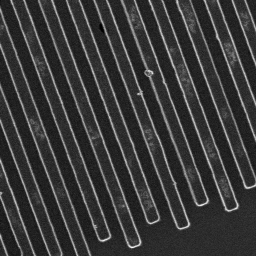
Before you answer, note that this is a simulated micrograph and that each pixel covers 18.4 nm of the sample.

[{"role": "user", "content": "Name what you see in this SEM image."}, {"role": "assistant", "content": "parallel lines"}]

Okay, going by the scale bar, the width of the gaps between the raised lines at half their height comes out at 257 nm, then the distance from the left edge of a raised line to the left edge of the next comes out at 477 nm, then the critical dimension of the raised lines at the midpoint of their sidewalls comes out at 220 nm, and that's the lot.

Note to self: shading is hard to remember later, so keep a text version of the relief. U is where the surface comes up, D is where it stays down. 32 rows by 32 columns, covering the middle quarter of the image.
UUUDDDDUUUDDDDUUUDDDDUUUDDDUUUUD
UUUDDDDUUUDDDDUUUDDDDUUUDDDDUUUD
UUUUDDDUUUUDDDUUUUDDUUUUDDDDUUUD
DUUUDDDDUUUDDDDUUUDDDDUUUDDDDUUU
DUUUDDDDUUUDDDDUUUDDDDUUUDDDDUUU
DDUUUDDDDUUUDDDUUUUDDDUUUUDDDUUU
DDUUUDDDDUUUDDDDUUUDDDDUUUDDDDUU
DDUUUUDDDUUUDDDDUUUDDDDUUUDDDDUU
DDDUUUDDDDUUUDDDDUUUDDDUUUUDDDUU
DDDUUUDDDDUUUDDDDUUUDDDDUUUDDDDU
DDDUUUUDDDUUUUDDDUUUDDDDUUUDDDDU
DDDDUUUDDDDUUUDDDDUUUDDDDUUUDDDU
DDDDUUUDDDDUUUDDDDUUUDDDDUUUDDDD
UDDDDUUUDDDUUUUDDDUUUUDDDUUUDDDD
UDDDDUUUDDDDUUUDDDDUUUDDDDUUUDDD
UUDDDUUUDDDDUUUDDDDUUUDDDDUUUDDD
UUDDDDUUUDDDDUUUDDDUUUUDDDUUUUDD
UUDDDDUUUDDDDUUUDDDDUUUDDDDUUUDD
UUUDDDUUUUDDDUUUDDDDUUUUDDDUUUDD
UUUDDDDUUUDDDDUUUDDDDUUUDDDDUUUD
UUUDDDDUUUDDDDUUUDDDDUUUDDDDUUUD
DUUUDDDUUUUDDDUUUUDDDUUUUDDDUUUD
DUUUDDDDUUUDDDDUUUDDDDUUUDDDDUUU
DUUUDDDDUUUDDDDUUUDDDDUUUDDDDUUU
DDUUUDDDDUUUDDDDUUUDDDUUUUDDDUUU
DDUUUDDDDUUUDDDDUUUDDDDUUUDDDDUU
DDUUUUDDDUUUDDDDUUUDDDDUUUDDDDUU
DDDUUUDDDDUUUDDDDUUUDDDDUUUDDDUU
DDDUUUDDDDUUUDDDDUUUDDDDUUUDDDDU
DDDUUUUDDDUUUUDDDUUUUDDDUUUUDDDU
DDDDUUUDDDDUUUDDDDUUUDDDDUUUDDDD
DDDDUUUDDDDUUUDDDDUUUDDDDUUUDDDD